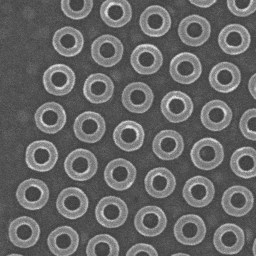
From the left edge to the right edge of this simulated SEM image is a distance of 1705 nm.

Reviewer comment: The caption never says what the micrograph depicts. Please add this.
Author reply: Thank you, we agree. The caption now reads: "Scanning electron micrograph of a regular array of ring-shaped raised bodies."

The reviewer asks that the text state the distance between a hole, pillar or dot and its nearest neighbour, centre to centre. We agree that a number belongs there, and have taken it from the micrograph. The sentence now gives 258 nm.